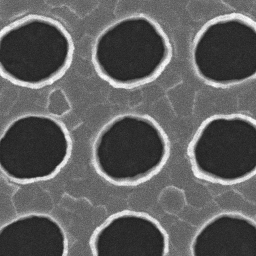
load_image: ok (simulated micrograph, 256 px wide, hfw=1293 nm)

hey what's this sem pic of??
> holes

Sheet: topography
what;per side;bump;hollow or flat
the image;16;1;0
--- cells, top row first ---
1111111111111111
1001111001111001
0000110000110000
0000110000110000
0000111000111000
1111111111111111
1111111111111111
1001111001111001
0000110000110000
0000110000110000
0001110000110000
1111111111111111
1111111111111111
1101111111111101
0000110000111000
0000110000110000